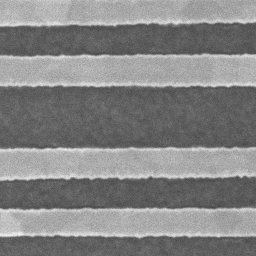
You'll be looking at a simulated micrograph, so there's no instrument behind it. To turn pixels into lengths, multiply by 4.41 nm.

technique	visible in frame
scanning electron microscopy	lines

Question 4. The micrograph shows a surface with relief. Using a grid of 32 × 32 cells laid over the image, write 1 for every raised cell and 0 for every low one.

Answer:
11111111111111111111111111111111
11111111111111111111111111111111
11111111111111111111111111111111
00000000000000000000000000000000
00000000000000000000000000000000
00000000000000000000000000000000
00000000000000000000000000000000
11111111111111111111111111111111
11111111111111111111111111111111
11111111111111111111111111111111
11111111111111111111111111111111
00000000000000000000000000000000
00000000000000000000000000000000
00000000000000000000000000000000
00000000000000000000000000000000
00000000000000000000000000000000
00000000000000000000000000000000
00000000000000000000000000000000
00000001000000001000110011010101
11111111111111111111111111111111
11111111111111111111111111111111
11111111111111111111111111111111
00000000000000000000000000000000
00000000000000000000000000000000
00000000000000000000000000000000
00000000000000000000000000000000
11111111111111111111111111111111
11111111111111111111111111111111
11111111111111111111111111111111
00000000000001010100000100010100
00000000000000000000000000000000
00000000000000000000000000000000